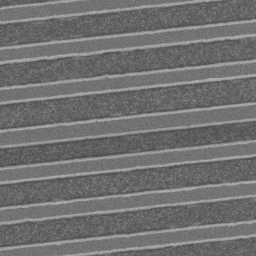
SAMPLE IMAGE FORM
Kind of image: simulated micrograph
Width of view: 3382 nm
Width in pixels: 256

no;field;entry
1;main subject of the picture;parallel lines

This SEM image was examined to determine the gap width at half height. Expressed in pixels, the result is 24.7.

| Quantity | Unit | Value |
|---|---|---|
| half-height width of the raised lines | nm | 194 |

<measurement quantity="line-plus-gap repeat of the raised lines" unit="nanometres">526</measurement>